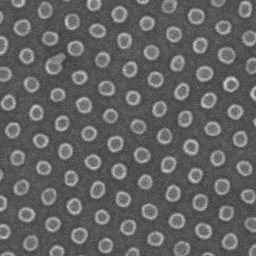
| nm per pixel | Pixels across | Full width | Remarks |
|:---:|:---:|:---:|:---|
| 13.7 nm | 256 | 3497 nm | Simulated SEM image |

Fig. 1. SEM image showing a regular array of raised bodies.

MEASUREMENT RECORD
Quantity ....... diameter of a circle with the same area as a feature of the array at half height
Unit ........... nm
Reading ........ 192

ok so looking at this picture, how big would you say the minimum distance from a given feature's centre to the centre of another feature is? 376 nm